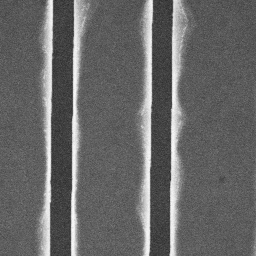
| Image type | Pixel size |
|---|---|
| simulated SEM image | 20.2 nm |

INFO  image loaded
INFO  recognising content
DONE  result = lines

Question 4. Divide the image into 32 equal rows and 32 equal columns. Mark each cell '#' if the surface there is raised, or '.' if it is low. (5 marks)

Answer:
######....#########...##########
######....#########...##########
######....#########...##########
######...##########...##########
######...##########...##########
######...##########...##########
######...##########...##########
######...##########...##########
######...##########...##########
######...##########...##########
######...##########...##########
######...##########...##########
######...##########...##########
######...##########...##########
######...##########...##########
######...##########...##########
######...##########...##########
######...##########...##########
######...##########...##########
######...##########...##########
######...##########...##########
######...##########...##########
######...##########...##########
######...##########...##########
######...#########....##########
######...#########...###########
######...#########...###########
######...#########...###########
######...##########..###########
######...##########..###########
######...##########..###########
######...##########..###########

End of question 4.